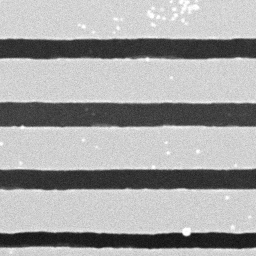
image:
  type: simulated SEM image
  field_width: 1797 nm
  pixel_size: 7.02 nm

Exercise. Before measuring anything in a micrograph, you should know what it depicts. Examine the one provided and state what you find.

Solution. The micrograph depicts lines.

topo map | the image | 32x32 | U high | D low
UUUUUUUUUUUUUUUUUUUUUUUUUUUUUUUU
UUUUUUUUUUUUUUUUUUUUUUUUUUUUUUUU
UUUUUUUUUUUUUUUUUUUUUUUUUUUUUUUU
UUUUUUUUUUUUUUUUUUUUUUUUUUUUUUUU
UUUUUUUUUUUUUUUUUUUUUUUUUUUUUUUU
DDDDDDDDDDDDDDDDDDDDDDDDDDDDDDDD
DDDDDDDDDDDDDDDDDDDDDDDDDDDDDDDD
UUUUUUUUUUUUUUUUUUUUUUUUUUUUUUUU
UUUUUUUUUUUUUUUUUUUUUUUUUUUUUUUU
UUUUUUUUUUUUUUUUUUUUUUUUUUUUUUUU
UUUUUUUUUUUUUUUUUUUUUUUUUUUUUUUU
UUUUUUUUUUUUUUUUUUUUUUUUUUUUUUUU
UUUUUUUUUUUUUUUUUUUUUUUUUUUUUUUU
DDDDDDDDDDDDDDDDDDDDDDDDDDDDDDDD
DDDDDDDDDDDDDDDDDDDDDDDDDDDDDDDD
DDDDDDDDDDDDDDDDDDDDDDDDDDDDDDDD
UUUUUUUUUUUUUUUUUUUUUUUUUUUUUUUU
UUUUUUUUUUUUUUUUUUUUUUUUUUUUUUUU
UUUUUUUUUUUUUUUUUUUUUUUUUUUUUUUU
UUUUUUUUUUUUUUUUUUUUUUUUUUUUUUUU
UUUUUUUUUUUUUUUUUUUUUUUUUUUUUUUU
DDDDDDDDDDDDDDDDDDDDDDDDDDDDDDDD
DDDDDDDDDDDDDDDDDDDDDDDDDDDDDDDD
DDDDDDDDDDDDDDDDDDDDDDDDDDDDDDDD
UUUUUUUUUUUUUUUUUUUUUUUUUUUUUUUU
UUUUUUUUUUUUUUUUUUUUUUUUUUUUUUUU
UUUUUUUUUUUUUUUUUUUUUUUUUUUUUUUU
UUUUUUUUUUUUUUUUUUUUUUUUUUUUUUUU
UUUUUUUUUUUUUUUUUUUUUUUUUUUUUUUU
DDDDDDDDDDDDDDDDDDDDDDDDDDDDDDDD
DDDDDDDDDDDDDDDDDDDDDDDDDDDDDDDD
UUUUUUUUUUUUUUUUUUUUUUUUUUUUUUUU